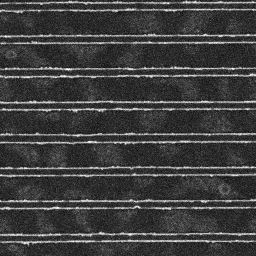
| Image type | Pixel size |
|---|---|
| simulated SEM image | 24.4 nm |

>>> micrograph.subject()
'parallel lines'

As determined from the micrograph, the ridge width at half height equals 0.192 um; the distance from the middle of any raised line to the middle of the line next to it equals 0.805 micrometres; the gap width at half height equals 609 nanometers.